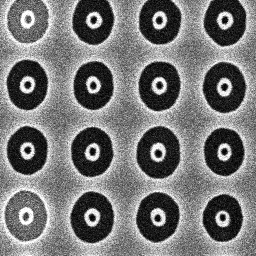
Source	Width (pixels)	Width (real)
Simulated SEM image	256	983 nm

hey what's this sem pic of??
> a regular array of ring-shaped grooves with a dot in the middle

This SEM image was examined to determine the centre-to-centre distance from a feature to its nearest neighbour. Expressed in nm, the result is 248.